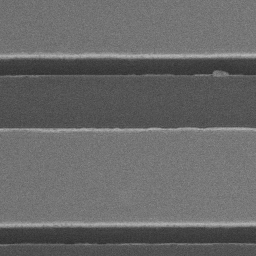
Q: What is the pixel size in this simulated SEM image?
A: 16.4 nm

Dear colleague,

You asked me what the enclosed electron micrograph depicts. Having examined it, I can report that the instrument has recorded lines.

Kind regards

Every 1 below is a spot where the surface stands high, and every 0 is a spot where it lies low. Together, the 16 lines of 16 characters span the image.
1111111111111111
1111111111111111
1111111111111111
1111111111111111
0000000000000000
0000000000000000
0000000000000000
0000000000000000
1111111111111111
1111111111111111
1111111111111111
1111111111111111
1111111111111111
1111111111111111
0000000000000000
0000000000000000